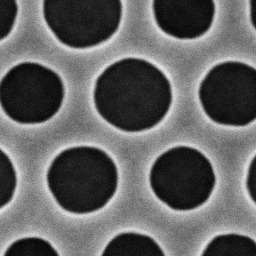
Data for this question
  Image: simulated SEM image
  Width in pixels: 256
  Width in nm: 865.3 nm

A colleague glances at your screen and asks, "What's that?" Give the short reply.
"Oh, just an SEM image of holes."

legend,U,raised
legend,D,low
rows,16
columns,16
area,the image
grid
DUUDDDDDUUDDDUUU
DUUDDDDDUUDDDUUU
UUUUDDDUUUUUUUUU
UUUUUUUUUUUUUUUU
DDDUUUDDDDUUUDDD
DDDDUUDDDDDUDDDD
DDDDUUDDDDDUUDDD
UDDUUUUDDDUUUDDD
UUUUUUUUUUUUUUUU
UUUUDDDUUUDDUUUU
DUUDDDDUUDDDDUUU
DUUDDDDUUDDDDUUD
DUUDDDDUUUDDDUUU
UUUUUUUUUUUUUUUU
UUUUUUUUUUUUUUUU
UDDUUUUDDDUUUDDD